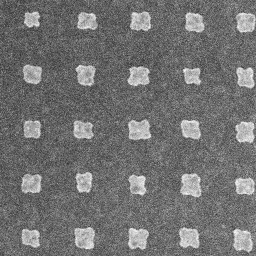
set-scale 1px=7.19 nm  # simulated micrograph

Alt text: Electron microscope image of a regular array of raised bodies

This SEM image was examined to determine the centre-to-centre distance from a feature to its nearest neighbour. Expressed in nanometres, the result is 381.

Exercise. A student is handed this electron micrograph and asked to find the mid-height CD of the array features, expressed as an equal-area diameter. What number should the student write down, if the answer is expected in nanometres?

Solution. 136